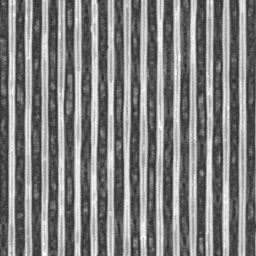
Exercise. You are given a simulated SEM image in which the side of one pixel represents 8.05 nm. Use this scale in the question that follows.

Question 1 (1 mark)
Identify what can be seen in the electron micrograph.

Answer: parallel lines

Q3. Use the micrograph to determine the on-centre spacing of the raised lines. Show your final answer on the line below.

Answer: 132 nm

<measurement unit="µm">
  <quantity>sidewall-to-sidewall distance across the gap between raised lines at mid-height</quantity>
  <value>0.0915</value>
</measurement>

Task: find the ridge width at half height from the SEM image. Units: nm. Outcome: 38.2